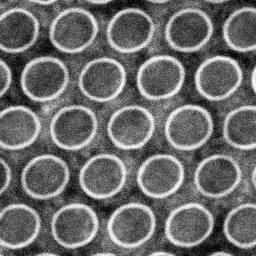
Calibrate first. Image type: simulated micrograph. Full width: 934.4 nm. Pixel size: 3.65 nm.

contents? a regular array of raised bodies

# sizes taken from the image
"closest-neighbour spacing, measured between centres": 205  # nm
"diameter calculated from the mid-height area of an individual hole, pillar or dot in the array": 154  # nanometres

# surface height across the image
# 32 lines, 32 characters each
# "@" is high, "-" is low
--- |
--------------------------------
-@@-----@@@----@@@-----@@-----@@
@@@@---@@@@@--@@@@@---@@@@---@@@
@@@@@--@@@@@--@@@@@--@@@@@--@@@@
@@@@---@@@@@--@@@@@--@@@@@--@@@@
@@@@---@@@@---@@@@----@@@----@@@
--------------------------------
-----@@------------@@@-----@@---
@--@@@@@---@@@@---@@@@@--@@@@@--
@--@@@@@--@@@@@--@@@@@@--@@@@@--
@--@@@@@--@@@@@--@@@@@@--@@@@@--
---@@@@---@@@@@---@@@@---@@@@---
--------------------------------
--@------@------@------@@-----@@
@@@@---@@@@@--@@@@@--@@@@@---@@@
@@@@@--@@@@@--@@@@@--@@@@@--@@@@
@@@@@--@@@@@--@@@@@--@@@@@--@@@@
@@@@---@@@@---@@@@---@@@@@---@@@
-----------------------@--------
--------------------------------
@---@@@@---@@@@---@@@@---@@@@---
@--@@@@@--@@@@@@--@@@@@--@@@@@--
@--@@@@@--@@@@@--@@@@@@--@@@@@--
@--@@@@@---@@@@---@@@@---@@@@---
----@@------@-------------------
--------------------------------
@@@@---@@@@----@@@@---@@@@---@@@
@@@@@--@@@@@--@@@@@--@@@@@--@@@@
@@@@@--@@@@@--@@@@@--@@@@@--@@@@
@@@@---@@@@---@@@@@--@@@@@---@@@
-@@-----@@-----@@-----@@------@@
--------------------------------